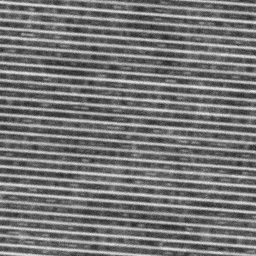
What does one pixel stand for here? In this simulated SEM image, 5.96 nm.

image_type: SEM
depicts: parallel lines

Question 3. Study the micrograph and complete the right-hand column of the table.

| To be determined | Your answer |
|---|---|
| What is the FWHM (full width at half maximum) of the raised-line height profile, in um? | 0.0112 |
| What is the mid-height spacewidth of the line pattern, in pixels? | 6.49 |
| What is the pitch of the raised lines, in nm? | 51.4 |